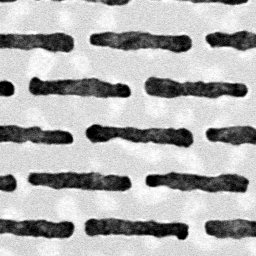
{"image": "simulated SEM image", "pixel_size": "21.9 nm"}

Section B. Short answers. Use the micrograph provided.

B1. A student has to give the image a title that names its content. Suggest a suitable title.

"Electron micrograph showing holes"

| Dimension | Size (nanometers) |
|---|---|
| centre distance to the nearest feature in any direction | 1590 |